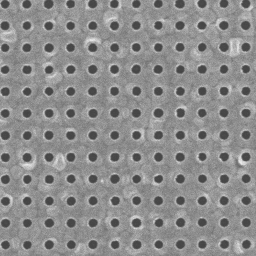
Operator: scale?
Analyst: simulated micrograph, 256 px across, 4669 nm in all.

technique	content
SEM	a regular array of holes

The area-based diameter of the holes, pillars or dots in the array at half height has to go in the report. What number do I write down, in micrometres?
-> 0.171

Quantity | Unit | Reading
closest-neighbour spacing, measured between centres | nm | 396